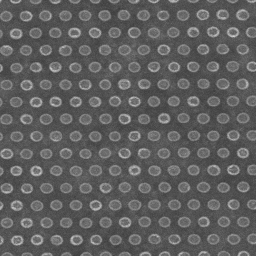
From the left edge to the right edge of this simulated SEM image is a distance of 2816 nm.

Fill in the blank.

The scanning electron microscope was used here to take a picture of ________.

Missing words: a regular array of raised bodies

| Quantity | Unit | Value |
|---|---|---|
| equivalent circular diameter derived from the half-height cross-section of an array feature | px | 10.8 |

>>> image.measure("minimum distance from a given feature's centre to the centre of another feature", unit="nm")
214